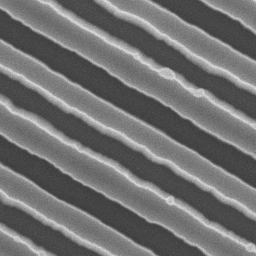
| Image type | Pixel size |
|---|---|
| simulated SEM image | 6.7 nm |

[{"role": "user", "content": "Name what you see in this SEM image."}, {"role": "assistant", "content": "lines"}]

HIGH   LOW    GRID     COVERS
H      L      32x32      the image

HHHHHHHLLLLLLHHHHHHLLLLLLLHHHHHH
LHHHHHHHLLLLLLLHHHHHHLLLLLLLHHHH
LLHHHHHHHLLLLLLLLHHHHHHLLLLLLLHH
LLLLHHHHHHHLLLLLLLLHHHHHHLLLLLLH
LLLLLLHHHHHHHLLLLLLLHHHHHHLLLLLL
HLLLLLLLHHHHHHHLLLLLLLHHHHHHLLLL
HHHLLLLLLLHHHHHHHLLLLLLHHHHHHHLL
HHHHLLLLLLLHHHHHHHLLLLLLLHHHHHHL
HHHHHHLLLLLLLHHHHHHHLLLLLLLHHHHH
LLHHHHHHLLLLLLHHHHHHHHLLLLLLLHHH
LLLLHHHHHLLLLLLLHHHHHHHLLLLLLLHH
LLLLLHHHHHHLLLLLLLHHHHHHHHLLLLLL
LLLLLLLHHHHHHLLLLLLLHHHHHHHLLLLL
HLLLLLLLHHHHHHLLLLLLLHHHHHHHLLLL
HHHLLLLLLLLHHHHHLLLLLLLHHHHHHHLL
HHHHHLLLLLLLHHHHHHLLLLLLLHHHHHHH
HHHHHHHLLLLLLLHHHHHHLLLLLLHHHHHH
LHHHHHHHLLLLLLLLHHHHHLLLLLLLHHHH
LLLHHHHHHHLLLLLLLLHHHHHLLLLLLLHH
LLLLLHHHHHHHLLLLLLLHHHHHHLLLLLLL
LLLLLLLHHHHHHHLLLLLLLHHHHHHLLLLL
HHLLLLLLHHHHHHHLLLLLLLLHHHHHLLLL
HHHLLLLLLLHHHHHHHLLLLLLLHHHHHHLL
HHHHHLLLLLLLHHHHHHHLLLLLLLHHHHHH
HHHHHHHLLLLLLHHHHHHHLLLLLLLLHHHH
LLHHHHHHLLLLLLLHHHHHHHLLLLLLLLHH
LLLLHHHHHHLLLLLLLHHHHHHHLLLLLLLH
LLLLLLHHHHHHLLLLLLHHHHHHHLLLLLLL
LLLLLLLLHHHHHHLLLLLLLHHHHHHLLLLL
HHLLLLLLLHHHHHHLLLLLLLHHHHHHHLLL
HHHHLLLLLLLHHHHHHLLLLLLLHHHHHHHL
HHHHHLLLLLLLLHHHHHHLLLLLLLHHHHHH